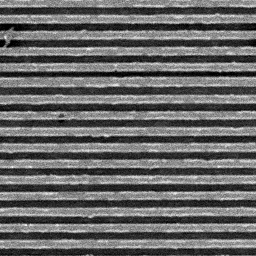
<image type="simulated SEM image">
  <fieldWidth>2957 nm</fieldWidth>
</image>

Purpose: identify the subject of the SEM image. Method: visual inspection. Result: parallel lines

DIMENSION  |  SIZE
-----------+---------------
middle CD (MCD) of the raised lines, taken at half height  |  0.0895 µm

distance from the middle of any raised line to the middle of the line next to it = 0.186 um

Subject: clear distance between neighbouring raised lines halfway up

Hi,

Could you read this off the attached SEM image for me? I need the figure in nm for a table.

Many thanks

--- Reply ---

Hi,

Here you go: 101